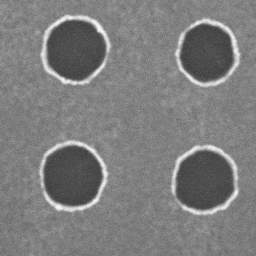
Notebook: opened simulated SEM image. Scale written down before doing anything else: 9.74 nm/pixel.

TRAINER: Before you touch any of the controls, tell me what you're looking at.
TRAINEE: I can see holes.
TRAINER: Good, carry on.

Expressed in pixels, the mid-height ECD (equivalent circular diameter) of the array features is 62.1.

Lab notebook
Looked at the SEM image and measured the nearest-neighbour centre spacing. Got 1.24 µm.